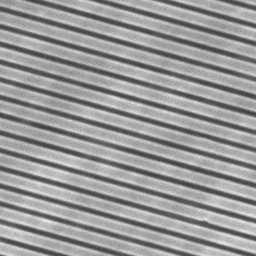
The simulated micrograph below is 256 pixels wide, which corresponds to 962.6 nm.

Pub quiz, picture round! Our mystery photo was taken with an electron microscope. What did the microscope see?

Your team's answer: parallel lines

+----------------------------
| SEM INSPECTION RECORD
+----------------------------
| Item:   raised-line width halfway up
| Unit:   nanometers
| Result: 41.7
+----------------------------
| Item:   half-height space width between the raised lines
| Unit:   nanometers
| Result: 22.2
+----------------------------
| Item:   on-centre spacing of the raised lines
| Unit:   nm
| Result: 64.2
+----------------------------